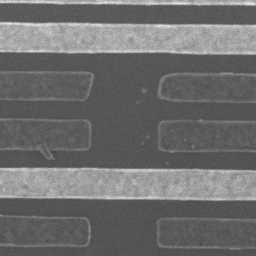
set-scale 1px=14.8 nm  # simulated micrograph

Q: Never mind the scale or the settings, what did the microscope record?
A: wiring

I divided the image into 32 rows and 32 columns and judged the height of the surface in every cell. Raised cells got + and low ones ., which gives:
...................+...........+
................................
................................
+++++++++++++++++++++++++++++...
++++++++++++++++++++++++++++++++
++++++++++++++++++++++++++++++++
.......................+++++++++
................................
................................
+++++++++++..........+++++++++++
+++++++++++.........++++++++++++
+++++++++++.........++++++++++++
.....................+++++++++++
................................
................................
+++++++++++..........+++++++++++
+++++++++++.........++++++++++++
+++++++++++.........++++++++++++
+++++++++++..........+++++++++++
......+.........................
................................
++++++++++++++++++++++++++++++++
++++++++++++++++++++++++++++++++
++++++++++++++++++++++++++++++++
++++++++++++++++++++++++++++++++
................................
................................
+++++++++++.....................
+++++++++++.........++++++++++++
+++++++++++.........++++++++++++
+++++++++++.........++++++++++++
................................